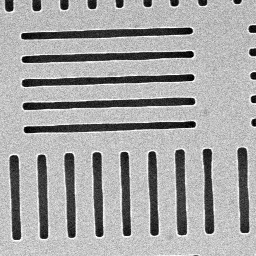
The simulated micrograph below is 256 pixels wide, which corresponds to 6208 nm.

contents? groups of lines, slits or small figures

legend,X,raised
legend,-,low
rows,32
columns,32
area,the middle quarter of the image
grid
XXXXXXXXXXXXXXXXXXXXXXXXXXXXXXXX
XXXXXXXXXXXXXXXXXXXXXXXXXXXXXXXX
XXXXXXXXXXXXXXXXXXXXXXXXXXXXXX--
--------------------------------
-------------------------------X
----XXXXXXXXXXXXXXXXXXXXXXXXXXXX
XXXXXXXXXXXXXXXXXXXXXXXXXXXXXXXX
XXXXXXXXXXXXXXXXXXXXXXXXXXXXXXXX
XXXXXXXXXXXXXXXXXXXX------------
--------------------------------
----------------------------XXXX
XXXXXXXXXXXXXXXXXXXXXXXXXXXXXXXX
XXXXXXXXXXXXXXXXXXXXXXXXXXXXXXXX
XXXXXXXXXXXXXXXXXXXXXXXXXXXXXXXX
XXXXXXXXXXXXXXXXXXXXXX----------
--------------------------------
-------------------------XXXXXXX
XXXXXXXXXXXXXXXXXXXXXXXXXXXXXXXX
XXXXXXXXXXXXXXXXXXXXXXXXXXXXXXXX
XXXXXXXXXXXXXXXXXXXXXXXXXXXXXXXX
XXXXXXXXXXXXXXXXXXXXXXXXXXXXXXXX
XXXXXXXXXXXXXXXXXXXXXXXXXXXX--XX
--XXXXX--XXXXX--XXXXX--XXXX---XX
---XXXX---XXXX--XXXXX--XXXXX--XX
---XXXX---XXXX--XXXXX--XXXXX--XX
---XXXX---XXXX--XXXXX--XXXXX--XX
---XXXX---XXXX--XXXXX--XXXXX--XX
---XXXX---XXXX--XXXXX---XXXX--XX
---XXXX---XXXX--XXXXX---XXXX--XX
---XXXX---XXXX--XXXXX---XXXX--XX
---XXXX---XXXX--XXXXX---XXXX--XX
---XXXX---XXXX---XXXX---XXXX--XX